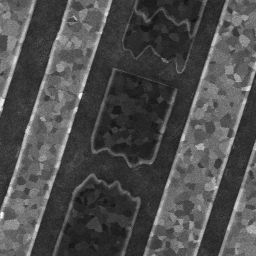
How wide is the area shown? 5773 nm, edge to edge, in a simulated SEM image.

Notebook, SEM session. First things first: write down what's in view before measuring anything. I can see one or a few lines or trenches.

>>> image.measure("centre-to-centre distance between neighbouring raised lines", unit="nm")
1740